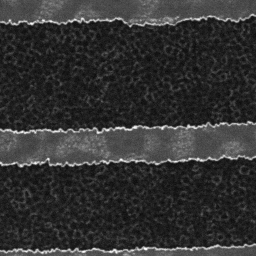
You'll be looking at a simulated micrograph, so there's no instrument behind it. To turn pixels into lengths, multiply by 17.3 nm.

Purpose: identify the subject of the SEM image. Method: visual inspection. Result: one or a few lines or trenches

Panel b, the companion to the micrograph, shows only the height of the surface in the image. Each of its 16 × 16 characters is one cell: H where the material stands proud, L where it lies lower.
LLLLLLLLLLLLLLLL
HHHHHHHHLLHHHHHH
HHHHHHHHHHHHHHHH
HHHHHHHHHHHHHHHH
HHHHHHHHHHHHHHHH
HHHHHHHHHHHHHHHH
HHHHHHHHHHHHHHHH
HHHHHHHHHHHHHHHH
LLLLLLLLLLLLLLLL
LLLLLLLLLLLLLLLL
HHHHHHHHHHHHHHHH
HHHHHHHHHHHHHHHH
HHHHHHHHHHHHHHHH
HHHHHHHHHHHHHHHH
HHHHHHHHHHHHHHHH
HHHHHHHHHHHHLLLL